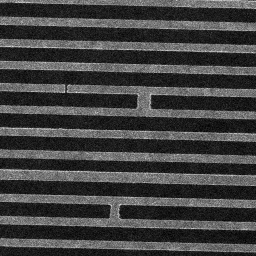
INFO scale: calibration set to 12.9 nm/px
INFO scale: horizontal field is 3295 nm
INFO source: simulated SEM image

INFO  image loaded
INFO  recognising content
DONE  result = parallel lines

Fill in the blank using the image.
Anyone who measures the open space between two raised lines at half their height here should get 185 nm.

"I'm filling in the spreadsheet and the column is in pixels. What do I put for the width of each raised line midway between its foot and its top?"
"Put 7.5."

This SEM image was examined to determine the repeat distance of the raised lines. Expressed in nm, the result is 285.